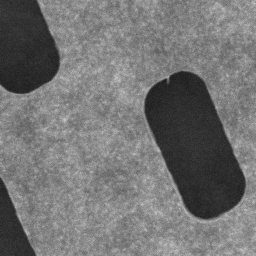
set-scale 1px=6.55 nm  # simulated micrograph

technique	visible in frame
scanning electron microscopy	holes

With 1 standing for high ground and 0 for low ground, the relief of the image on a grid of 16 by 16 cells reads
0001111111111111
0001111111111111
0001111111111111
0000111111111111
0000111111101111
0011111110000111
1111111110000111
1111111110000011
1111111111000011
1111111111000001
1111111111000001
1111111111100001
0111111111100001
0111111111110011
0011111111111111
0011111111111111